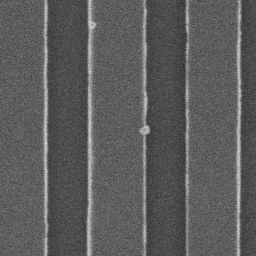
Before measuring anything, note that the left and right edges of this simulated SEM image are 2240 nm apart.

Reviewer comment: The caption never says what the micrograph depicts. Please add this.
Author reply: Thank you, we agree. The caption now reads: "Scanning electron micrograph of lines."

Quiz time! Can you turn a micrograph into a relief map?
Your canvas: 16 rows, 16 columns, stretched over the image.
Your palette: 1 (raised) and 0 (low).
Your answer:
1110001110001110
1110001110001110
1110001110001110
1110001110001110
1110001110001110
1110001110001110
1110001110001110
1110001110001110
1110001110001110
1110001110001110
1110001110001110
1110001110001110
1110001110001110
1110001110001110
1110001110001110
1110001110001110